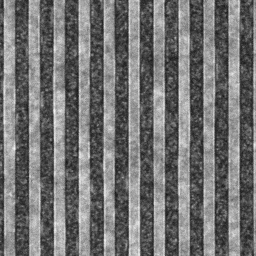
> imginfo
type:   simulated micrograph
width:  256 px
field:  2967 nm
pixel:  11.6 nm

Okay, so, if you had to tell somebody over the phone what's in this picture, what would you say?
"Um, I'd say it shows parallel lines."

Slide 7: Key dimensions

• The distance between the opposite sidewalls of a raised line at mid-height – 117 nm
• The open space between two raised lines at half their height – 171 nm